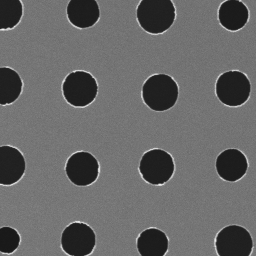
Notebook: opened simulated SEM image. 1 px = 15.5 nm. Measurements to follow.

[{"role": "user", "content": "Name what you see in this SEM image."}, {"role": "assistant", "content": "holes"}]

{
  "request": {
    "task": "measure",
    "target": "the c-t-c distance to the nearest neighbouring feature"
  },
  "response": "74.6 pixels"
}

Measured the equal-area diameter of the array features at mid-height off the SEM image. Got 543 nm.